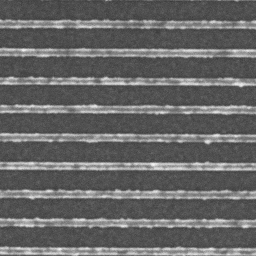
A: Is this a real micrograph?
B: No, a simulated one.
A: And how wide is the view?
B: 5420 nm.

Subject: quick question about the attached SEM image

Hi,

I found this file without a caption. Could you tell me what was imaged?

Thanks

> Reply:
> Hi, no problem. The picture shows parallel lines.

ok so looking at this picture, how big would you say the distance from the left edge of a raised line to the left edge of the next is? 0.601 µm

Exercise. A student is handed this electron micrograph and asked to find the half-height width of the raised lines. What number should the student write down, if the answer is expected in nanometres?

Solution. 138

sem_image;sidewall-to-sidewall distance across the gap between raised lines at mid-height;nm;468